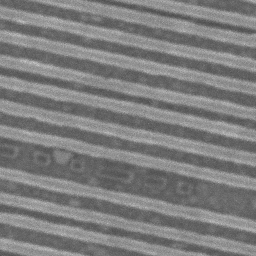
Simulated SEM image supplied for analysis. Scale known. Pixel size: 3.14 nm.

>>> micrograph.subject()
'parallel lines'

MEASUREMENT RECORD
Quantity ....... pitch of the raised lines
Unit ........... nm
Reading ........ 70.4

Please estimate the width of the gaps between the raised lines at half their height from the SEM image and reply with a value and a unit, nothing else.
13.5 px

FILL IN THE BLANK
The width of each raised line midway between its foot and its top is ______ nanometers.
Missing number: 29.2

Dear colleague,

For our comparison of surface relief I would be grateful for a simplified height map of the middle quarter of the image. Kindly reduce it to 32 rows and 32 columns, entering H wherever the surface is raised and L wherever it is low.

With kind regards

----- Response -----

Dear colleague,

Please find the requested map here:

LLLLLLLLLLLLLLHHHHHHHHHHHLLLLLLL
HLLLLLLLLLLLLLLLLLLHHHHHHHHHHHHL
HHHHLLLLLLLLLLLLLLLLLLLHLLHHHHHH
HHHHHHHHHLLLLLLLLLLLLLLLLLLLLHHH
LLLLHHHHHHHHHHHLLLLLLLLLLLLLLLLL
LLLLLLLLHHHHHHHHHHHLLLLLLLLLLLLL
LLLLLLLLLLLLLHHHHHHHHHHHLLLLLLLL
HHHHHLLLLLLLLLLLLHHHHHHHHHHHHLLL
HHHHHHHHHHLLLLLLLLLLLHHHHHHHHHHH
LLLLHHHHHHHHHHLLLLLLLLLLLLLHHHHH
LLLLLLLLHHHHHHHHHHHHLLLLLLLLLLLL
LLLLLLLLLLLLHHHHHHHHHHHHLLLLLLLL
LLLLLLLLLLLLLLLLLLHHHHHHHHHHHLLL
HHHHLLLLLLLLLLLLLLLLLHHHHHHHHHHH
HHHHHHHHHLLLLLLLLLLLLLLLLLHHHHHH
LLHHHHHHHHHHHLLLLLLLLLLLLLLLLLLH
LLLLLLLHHHHHHHHHHLLLLLLLLLLLLLLL
LLLLLLLLLLLLHHHHHHHHHHHLLLLLLLLL
LLLLLLLLLLLLLLLHHHHHHHHHHHHHLLLL
HHHLLLLLLLLLLLLLLLLLLHHHHHHHHHHH
HHHHHHHLLLLLLLLLLLLLLLLLLLHHHHHH
LLHHHHHHHHHHLLLLLLLLLLLLLLLLLLHH
HHLLLLLHHHHHHHHHHHLLLLLLLLLLLLLL
HLLLLLLLLLLLHHHHHHHHHHLLLLLLLLLL
LLHHHLLLLLLLLLLLHHHHHHHHHHHHLLLL
LLHHHLLLLLLLLLLLLLLLHHHHHHHHHHHH
LLLHHLLLLHHHHHLLLLLLLLLLLLHHHHHH
LLLLLLLLHHHHHHHHHLLLLLLLLLLLLLLH
LLLLLLLLLLLLHHHHHLLLHHHHLLLLLLLL
HHLLLLLLLLLLLLLLLLLLHHHHHHLLLLLL
HHHHHLLLLLLLLLLLLLLLLHHHHLLLLHHH
HHHHHHHHHLLLLLLLLLLLLLLLLLLLLHHH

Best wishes